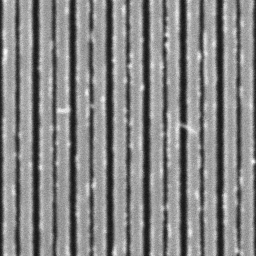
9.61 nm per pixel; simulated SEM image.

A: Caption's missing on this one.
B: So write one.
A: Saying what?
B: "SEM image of parallel lines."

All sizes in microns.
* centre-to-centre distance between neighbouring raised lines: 0.175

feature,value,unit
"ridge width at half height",118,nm